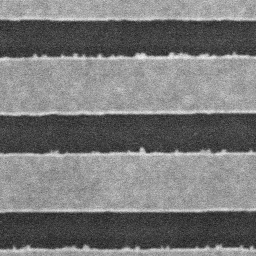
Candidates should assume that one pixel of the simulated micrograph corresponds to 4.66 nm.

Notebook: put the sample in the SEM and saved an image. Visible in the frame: lines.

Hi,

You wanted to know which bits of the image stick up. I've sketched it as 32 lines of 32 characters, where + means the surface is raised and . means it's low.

++++++++++++++++++++++++++++++++
++++++++++++++++++++++++++++++++
.++...+++++++++.+++...++++++.+++
................................
................................
................................
................................
++++++++++++++++++++++++++++++++
++++++++++++++++++++++++++++++++
++++++++++++++++++++++++++++++++
++++++++++++++++++++++++++++++++
++++++++++++++++++++++++++++++++
++++++++++++++++++++++++++++++++
++++++++++++++++++++++++++++++++
................................
................................
................................
................................
................................
++++++++++++++++++++++++++++++++
++++++++++++++++++++++++++++++++
++++++++++++++++++++++++++++++++
++++++++++++++++++++++++++++++++
++++++++++++++++++++++++++++++++
++++++++++++++++++++++++++++++++
++++++++++++++++++++++++++++++++
+...............................
................................
................................
................................
................................
++++++++++++++++++++++++++++++++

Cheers